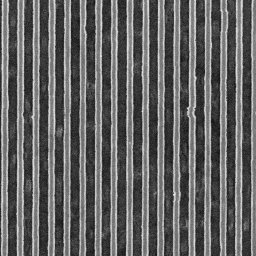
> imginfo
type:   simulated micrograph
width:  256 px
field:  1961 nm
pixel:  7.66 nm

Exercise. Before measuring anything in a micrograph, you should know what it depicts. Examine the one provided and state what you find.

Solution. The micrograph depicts parallel lines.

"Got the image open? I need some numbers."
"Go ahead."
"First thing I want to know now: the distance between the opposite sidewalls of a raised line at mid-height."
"45 nm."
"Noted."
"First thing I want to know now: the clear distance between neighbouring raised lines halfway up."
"77.5 nm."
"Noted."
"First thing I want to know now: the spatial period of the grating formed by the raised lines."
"0.119 µm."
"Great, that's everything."